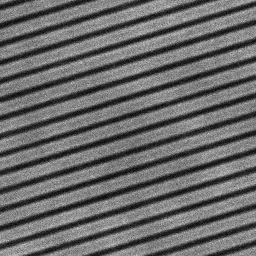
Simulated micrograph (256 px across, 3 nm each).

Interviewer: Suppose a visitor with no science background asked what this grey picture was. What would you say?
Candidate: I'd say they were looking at parallel lines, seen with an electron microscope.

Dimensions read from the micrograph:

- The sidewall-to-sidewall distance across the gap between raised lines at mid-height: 19.8 nanometers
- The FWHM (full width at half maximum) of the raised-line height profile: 31.2 nm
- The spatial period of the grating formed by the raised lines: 52.9 nm